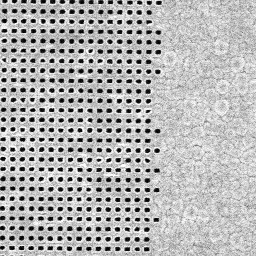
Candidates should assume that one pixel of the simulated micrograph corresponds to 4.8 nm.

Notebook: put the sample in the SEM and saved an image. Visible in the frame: a regular array of holes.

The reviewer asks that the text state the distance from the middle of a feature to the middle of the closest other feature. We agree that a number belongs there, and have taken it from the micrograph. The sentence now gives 44.6 nanometres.